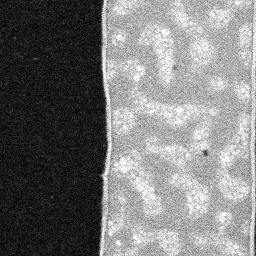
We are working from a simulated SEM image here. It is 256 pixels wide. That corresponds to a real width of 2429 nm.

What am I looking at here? one or a few lines or trenches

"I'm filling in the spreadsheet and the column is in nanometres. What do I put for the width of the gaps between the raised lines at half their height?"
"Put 1400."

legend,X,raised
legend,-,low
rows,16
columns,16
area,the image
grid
XXXXXXX---------
XXXXXXX---------
XXXXXXX---------
XXXXXXX---------
XXXXXXX---------
XXXXXXX---------
XXXXXXX---------
XXXXXXX---------
XXXXXXX---------
XXXXXXX---------
XXXXXXX---------
XXXXXXX---------
XXXXXXX---------
XXXXXXX---------
XXXXXX----------
XXXXXX----------